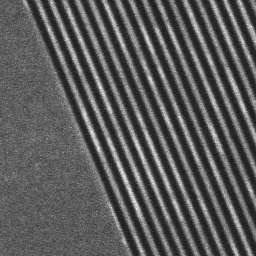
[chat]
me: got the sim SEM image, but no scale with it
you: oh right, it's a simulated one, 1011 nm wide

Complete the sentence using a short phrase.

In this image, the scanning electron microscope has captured parallel lines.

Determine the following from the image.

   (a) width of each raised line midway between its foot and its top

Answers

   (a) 0.02 microns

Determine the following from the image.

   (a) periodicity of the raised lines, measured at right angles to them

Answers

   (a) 48.9 nanometres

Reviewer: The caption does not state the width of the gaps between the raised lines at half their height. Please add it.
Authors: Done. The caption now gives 0.0301 um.